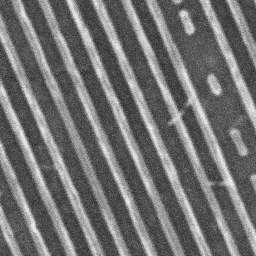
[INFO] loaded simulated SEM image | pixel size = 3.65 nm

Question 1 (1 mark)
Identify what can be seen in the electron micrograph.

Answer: parallel lines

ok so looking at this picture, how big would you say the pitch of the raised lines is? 90.5 nm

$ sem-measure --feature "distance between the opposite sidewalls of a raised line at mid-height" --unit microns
0.0276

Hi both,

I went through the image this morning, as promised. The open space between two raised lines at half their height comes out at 17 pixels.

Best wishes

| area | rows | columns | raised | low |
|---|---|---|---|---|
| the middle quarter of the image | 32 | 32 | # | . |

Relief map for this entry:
.##.....##....##......##....##..
.##.....##.....##.....##....##..
..##....##.....##.....##.....##.
..##.....##.....##.....##....##.
...##....##.....##.....##.....#.
...##.....##....##......##....##
...##.....##.....##.....##....##
....##.....##....##......#.....#
....##.....##.....##.....##....#
.....##....###....##......#....#
.....##.....##.....##.....##....
#....###....###....##.....##....
#.....##.....##....##......##...
##....##.....##.....##.....##...
##.....##.....##....###....##...
##.....##.....##.....##.....##..
.##.....##....##.....##.....##..
.##.....##.....##.....##.....##.
..##.....##....##.....##.....##.
..##.....##.....##....##......##
...##....##.....##.....##.....##
...##.....##....###....##......#
...###....##.....##.....##.....#
....##.....##....###....##......
....##.....##.....##.....##.....
.....##....###....##.....##.....
.....##.....##.....##....###....
#.....##....##.....##.....##....
#.....##.....##.....##....##....
##.....##....##.....##.....##...
##.....##.....##....##.....##...
.##....###....##.....##.....##..